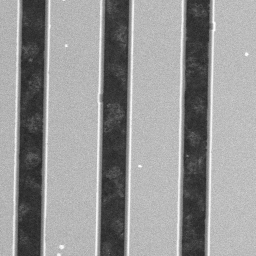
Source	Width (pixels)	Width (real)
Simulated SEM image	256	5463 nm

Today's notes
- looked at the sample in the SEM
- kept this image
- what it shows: one or a few lines or trenches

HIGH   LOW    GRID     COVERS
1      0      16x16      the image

1001110011100111
1001110011100111
1001110011100111
1001110011100111
1001110011100111
1001110011100111
1001110011100111
1001110011100111
1001110011100111
1001110011100111
1001110011100111
1001110011100111
1001110011100111
1001110011100111
1001110011100111
1001110011100111